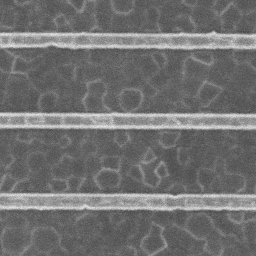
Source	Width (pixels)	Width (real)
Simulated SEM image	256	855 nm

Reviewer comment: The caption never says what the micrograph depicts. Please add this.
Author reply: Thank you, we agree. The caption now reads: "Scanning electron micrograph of one or a few lines or trenches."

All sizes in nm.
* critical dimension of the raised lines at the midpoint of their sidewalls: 41.3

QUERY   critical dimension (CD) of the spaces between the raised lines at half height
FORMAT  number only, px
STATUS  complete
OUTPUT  68.4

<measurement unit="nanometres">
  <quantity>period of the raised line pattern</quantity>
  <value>269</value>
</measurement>